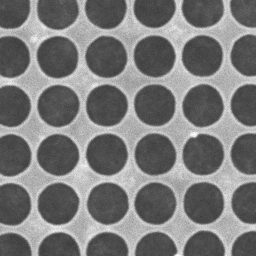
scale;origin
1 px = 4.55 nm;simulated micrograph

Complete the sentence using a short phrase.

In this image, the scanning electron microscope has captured a regular array of holes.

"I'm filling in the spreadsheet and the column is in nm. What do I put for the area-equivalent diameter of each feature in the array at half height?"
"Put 192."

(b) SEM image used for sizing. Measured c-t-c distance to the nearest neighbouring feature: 0.219 um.